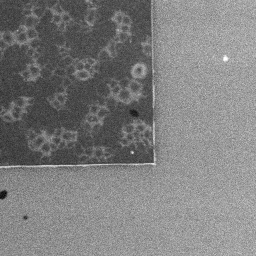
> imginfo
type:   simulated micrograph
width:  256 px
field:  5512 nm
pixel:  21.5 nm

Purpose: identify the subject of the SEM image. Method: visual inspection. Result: one or a few lines or trenches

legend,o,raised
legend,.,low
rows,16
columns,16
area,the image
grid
ooooooooo.......
ooooooooo.......
oooooooooo......
oooooooooo......
oooooooooo......
oooooooooo......
oooooooooo......
oooooooooo......
oooooooooo......
oooooooooo......
................
................
................
................
................
................